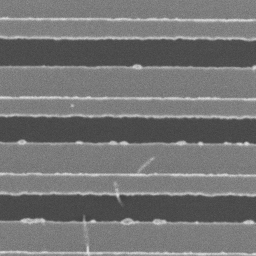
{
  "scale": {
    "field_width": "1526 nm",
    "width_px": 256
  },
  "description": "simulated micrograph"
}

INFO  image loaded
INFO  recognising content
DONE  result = lines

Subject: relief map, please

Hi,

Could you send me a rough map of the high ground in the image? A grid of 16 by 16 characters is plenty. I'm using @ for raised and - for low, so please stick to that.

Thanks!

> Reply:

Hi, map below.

@@@@@@@@@@@@@@@@
@@@@@@@@@@@@@@@@
---------------@
----------------
@@@@@@@@@@@@@@@@
@@@@@@@@@@@@@@@@
@@@@@@@@@@@@@@@@
----------------
----------------
@@@@@@@@@@@@@@@@
@@@@@@@@@@@@@@@@
@@@@@@@@@@@@@@@@
----------------
----------------
@@@@@@@@@@@@@@@@
@@@@@@@@@@@@@@@@